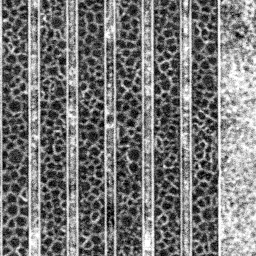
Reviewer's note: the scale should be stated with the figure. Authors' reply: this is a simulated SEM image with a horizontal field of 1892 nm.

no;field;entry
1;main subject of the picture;parallel lines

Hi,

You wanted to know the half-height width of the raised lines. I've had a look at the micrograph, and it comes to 211 nm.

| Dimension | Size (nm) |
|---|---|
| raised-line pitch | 280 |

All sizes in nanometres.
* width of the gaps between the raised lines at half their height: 68.4